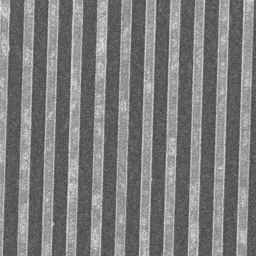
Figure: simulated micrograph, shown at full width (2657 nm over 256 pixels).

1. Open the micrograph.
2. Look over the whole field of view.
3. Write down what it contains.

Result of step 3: parallel lines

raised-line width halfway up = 96 nanometres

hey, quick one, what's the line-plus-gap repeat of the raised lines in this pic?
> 253 nm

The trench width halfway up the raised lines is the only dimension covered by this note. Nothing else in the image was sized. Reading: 0.154 um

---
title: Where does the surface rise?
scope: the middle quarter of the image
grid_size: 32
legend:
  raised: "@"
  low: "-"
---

--@@----@@----@@----@@----@@@---
--@@----@@----@@----@@----@@@---
--@@----@@----@@----@@----@@----
--@@----@@----@@----@@----@@----
--@@----@@----@@----@@----@@----
--@@----@@----@@----@@----@@----
--@@----@@----@@----@@----@@----
--@@----@@----@@----@@----@@----
--@@----@@----@@----@@----@@----
--@@----@@----@@----@@----@@----
--@@----@@----@@----@@----@@----
--@@----@@----@@----@@----@@----
--@@----@@----@@----@@----@@----
--@@----@@----@@----@@----@@----
--@@----@@----@@----@@----@@----
--@@----@@----@@----@@----@@----
--@@----@@----@@----@@----@@----
--@@----@@----@@----@@----@@----
--@@----@@----@@----@@----@@----
--@@----@@----@@----@@----@@----
--@@----@@----@@----@@----@@----
-@@@----@@----@@----@@----@@----
-@@@---@@@----@@----@@----@@----
-@@@---@@@---@@@----@@----@@----
-@@----@@@---@@@----@@----@@----
-@@----@@----@@@---@@@----@@----
-@@----@@----@@----@@@----@@----
-@@----@@----@@----@@@----@@----
-@@----@@----@@----@@@----@@----
-@@----@@----@@----@@@----@@----
-@@----@@----@@----@@@----@@----
-@@----@@----@@----@@-----@@----